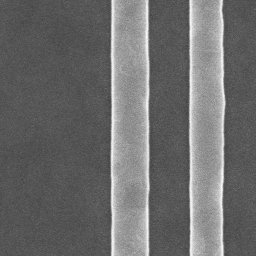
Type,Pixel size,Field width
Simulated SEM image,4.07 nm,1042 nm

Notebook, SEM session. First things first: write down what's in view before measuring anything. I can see one or a few lines or trenches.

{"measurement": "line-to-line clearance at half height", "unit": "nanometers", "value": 170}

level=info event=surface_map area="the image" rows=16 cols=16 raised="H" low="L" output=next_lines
LLLLLLLHHLLLHHLL
LLLLLLLHHLLLHHLL
LLLLLLLHHLLLHHLL
LLLLLLLHHLLLHHLL
LLLLLLLHHLLLHHLL
LLLLLLLHHLLLHHLL
LLLLLLLHHLLLHHLL
LLLLLLLHHLLLHHLL
LLLLLLLHHLLLHHLL
LLLLLLLHHLLLHHLL
LLLLLLLHHLLLHHLL
LLLLLLLHHLLLHHLL
LLLLLLLHHLLLHHLL
LLLLLLLHHLLLHHLL
LLLLLLLHHLLLHHLL
LLLLLLLHHLLLHHLL